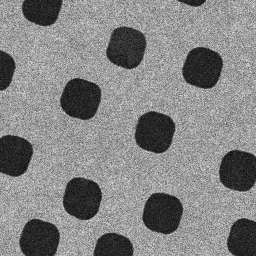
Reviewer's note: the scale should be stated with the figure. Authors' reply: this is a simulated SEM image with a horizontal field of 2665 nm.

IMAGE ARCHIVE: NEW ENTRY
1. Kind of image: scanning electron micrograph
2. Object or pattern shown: holes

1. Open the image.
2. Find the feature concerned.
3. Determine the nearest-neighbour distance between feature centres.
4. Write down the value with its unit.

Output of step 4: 826 nm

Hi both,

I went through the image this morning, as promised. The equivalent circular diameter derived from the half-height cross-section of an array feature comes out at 428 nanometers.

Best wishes